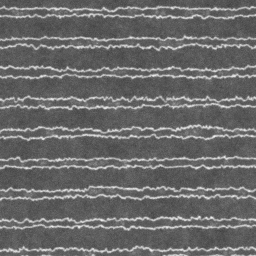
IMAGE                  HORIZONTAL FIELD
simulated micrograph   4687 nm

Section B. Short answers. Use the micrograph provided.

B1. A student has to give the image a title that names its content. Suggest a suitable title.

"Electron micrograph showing parallel lines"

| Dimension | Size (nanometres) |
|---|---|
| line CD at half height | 146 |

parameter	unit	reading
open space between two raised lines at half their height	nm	405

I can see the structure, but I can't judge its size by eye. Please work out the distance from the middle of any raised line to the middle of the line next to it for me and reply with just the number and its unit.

0.551 microns